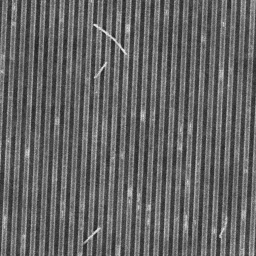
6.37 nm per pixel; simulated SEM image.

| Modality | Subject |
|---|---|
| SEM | parallel lines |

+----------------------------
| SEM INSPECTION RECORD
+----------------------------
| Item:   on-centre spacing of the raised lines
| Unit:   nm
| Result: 60.7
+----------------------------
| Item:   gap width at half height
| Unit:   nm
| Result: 29.4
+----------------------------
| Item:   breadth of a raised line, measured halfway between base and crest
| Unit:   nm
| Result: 29.4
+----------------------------